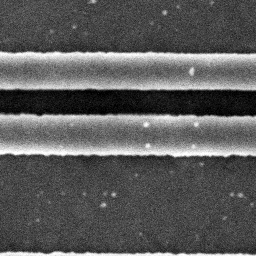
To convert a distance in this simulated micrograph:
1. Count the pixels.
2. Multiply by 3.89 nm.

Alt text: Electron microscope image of lines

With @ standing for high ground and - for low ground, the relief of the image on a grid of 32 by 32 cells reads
--------------------------------
--------------------------------
--------------------------------
--------------------------------
--------------------------------
--------------------------------
--------------------------------
@@@@@@@@@@@@@@@@@@@@@@@@@@@@@@@@
@@@@@@@@@@@@@@@@@@@@@@@@@@@@@@@@
@@@@@@@@@@@@@@@@@@@@@@@@@@@@@@@@
@@@@@@@@@@@@@@@@@@@@@@@@@@@@@@@@
--------------------------------
--------------------------------
--------------------------------
@@@@@@@@@@@@@@@@@@@----@--------
@@@@@@@@@@@@@@@@@@@@@@@@@@@@@@@@
@@@@@@@@@@@@@@@@@@@@@@@@@@@@@@@@
@@@@@@@@@@@@@@@@@@@@@@@@@@@@@@@@
@@@@@@@@@@@@@@@@@@@@@@@@@@@@@@@@
----------------------@---------
--------------------------------
--------------------------------
--------------------------------
--------------------------------
--------------------------------
--------------------------------
--------------------------------
--------------------------------
--------------------------------
--------------------------------
--------------------------------
--------------------------------